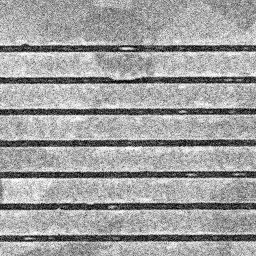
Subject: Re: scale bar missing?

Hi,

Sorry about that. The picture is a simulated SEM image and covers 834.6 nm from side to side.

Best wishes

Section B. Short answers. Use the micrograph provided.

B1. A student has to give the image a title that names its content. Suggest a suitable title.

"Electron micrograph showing parallel lines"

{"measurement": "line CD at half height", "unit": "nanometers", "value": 77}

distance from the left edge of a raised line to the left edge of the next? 0.103 um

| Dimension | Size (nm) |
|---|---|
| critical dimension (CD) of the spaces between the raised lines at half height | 26.5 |